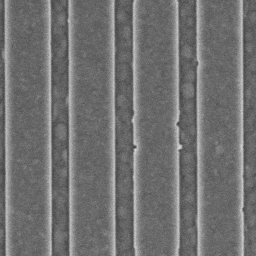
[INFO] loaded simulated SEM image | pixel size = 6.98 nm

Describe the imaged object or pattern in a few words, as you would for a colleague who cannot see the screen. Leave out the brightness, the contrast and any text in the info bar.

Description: one or a few lines or trenches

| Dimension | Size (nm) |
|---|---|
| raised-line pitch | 447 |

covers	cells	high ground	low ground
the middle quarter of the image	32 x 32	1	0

01111111111110000011111111110000
01111111111110000011111111110000
01111111111110000011111111110000
01111111111110000011111111110000
01111111111110000011111111110000
01111111111110000011111111110000
01111111111110000011111111110001
01111111111110000011111111110000
01111111111110000011111111110000
01111111111110000011111111110000
01111111111110000011111111110000
01111111111110000011111111111000
01111111111110000011111111111000
01111111111110000111111111110000
01111111111110000111111111110000
01111111111110000011111111110000
01111111111110000011111111111000
01111111111110000011111111111000
01111111111110000011111111111000
01111111111110000011111111111000
01111111111110000011111111111000
01111111111110000011111111111000
01111111111110000011111111111000
01111111111110000011111111111000
01111111111110000011111111111000
01111111111110000011111111111000
01111111111110000011111111111000
01111111111110000011111111111000
01111111111110000111111111111000
01111111111110000011111111111000
01111111111110000011111111111000
01111111111110000011111111111000